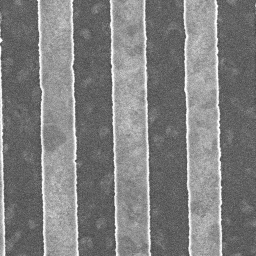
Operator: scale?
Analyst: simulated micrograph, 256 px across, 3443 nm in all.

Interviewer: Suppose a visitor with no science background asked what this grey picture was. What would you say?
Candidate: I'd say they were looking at one or a few lines or trenches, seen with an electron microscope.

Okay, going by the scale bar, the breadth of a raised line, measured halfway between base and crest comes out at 446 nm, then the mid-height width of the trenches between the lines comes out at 0.526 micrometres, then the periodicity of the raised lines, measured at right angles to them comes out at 72.3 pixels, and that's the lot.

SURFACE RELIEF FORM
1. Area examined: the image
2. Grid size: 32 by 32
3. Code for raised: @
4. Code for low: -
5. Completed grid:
-----@@@@-----@@@@-----@@@@-----
-----@@@@-----@@@@-----@@@@-----
-----@@@@-----@@@@-----@@@@-----
-----@@@@-----@@@@-----@@@@-----
-----@@@@-----@@@@-----@@@@-----
-----@@@@-----@@@@-----@@@@-----
-----@@@@-----@@@@-----@@@@-----
-----@@@@-----@@@@-----@@@@-----
-----@@@@-----@@@@-----@@@@-----
-----@@@@-----@@@@-----@@@@-----
-----@@@@-----@@@@-----@@@@-----
-----@@@@-----@@@@-----@@@@-----
-----@@@@-----@@@@-----@@@@-----
-----@@@@-----@@@@-----@@@@-----
-----@@@@-----@@@@-----@@@@-----
-----@@@@-----@@@@-----@@@@-----
-----@@@@-----@@@@-----@@@@-----
-----@@@@-----@@@@-----@@@@-----
-----@@@@-----@@@@@----@@@@-----
-----@@@@-----@@@@@----@@@@-----
-----@@@@-----@@@@-----@@@@@----
-----@@@@-----@@@@@----@@@@@----
-----@@@@-----@@@@@----@@@@@----
-----@@@@-----@@@@@----@@@@@----
-----@@@@@----@@@@@-----@@@@----
-----@@@@@----@@@@@-----@@@@----
-----@@@@@----@@@@@-----@@@@----
------@@@@----@@@@@-----@@@@----
@----@@@@@-----@@@@-----@@@@----
@----@@@@@----@@@@@-----@@@@----
@-----@@@@-----@@@@-----@@@@----
@-----@@@@-----@@@@-----@@@@----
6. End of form